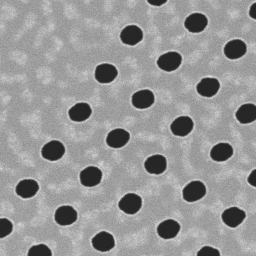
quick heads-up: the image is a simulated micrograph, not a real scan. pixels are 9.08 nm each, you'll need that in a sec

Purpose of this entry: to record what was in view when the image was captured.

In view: a regular array of holes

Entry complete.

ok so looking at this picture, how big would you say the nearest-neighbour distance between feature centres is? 0.417 um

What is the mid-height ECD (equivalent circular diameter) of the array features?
198 nm